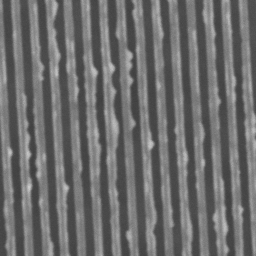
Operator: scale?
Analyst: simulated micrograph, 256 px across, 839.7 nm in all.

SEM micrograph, parallel lines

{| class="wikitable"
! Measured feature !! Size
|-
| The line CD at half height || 27.8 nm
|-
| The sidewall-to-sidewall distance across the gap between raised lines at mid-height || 30.2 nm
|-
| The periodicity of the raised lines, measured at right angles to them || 57.4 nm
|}